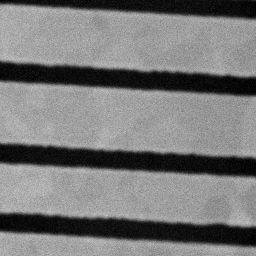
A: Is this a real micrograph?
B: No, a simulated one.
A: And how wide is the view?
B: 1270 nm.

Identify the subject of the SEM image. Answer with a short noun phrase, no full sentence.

lines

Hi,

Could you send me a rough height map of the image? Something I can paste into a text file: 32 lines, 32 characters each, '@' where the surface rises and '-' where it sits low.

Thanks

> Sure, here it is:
--------------------------------
@@@@@@@@@@@@@@@@----------------
@@@@@@@@@@@@@@@@@@@@@@@@@@@@@@@@
@@@@@@@@@@@@@@@@@@@@@@@@@@@@@@@@
@@@@@@@@@@@@@@@@@@@@@@@@@@@@@@@@
@@@@@@@@@@@@@@@@@@@@@@@@@@@@@@@@
@@@@@@@@@@@@@@@@@@@@@@@@@@@@@@@@
@@@@@@@@@@@@@@@@@@@@@@@@@@@@@@@@
------------@@@@@@@@@@@@@@@@@@@@
-----------------------------@@@
@@@@@@--------------------------
@@@@@@@@@@@@@@@@@@@@@@@---------
@@@@@@@@@@@@@@@@@@@@@@@@@@@@@@@@
@@@@@@@@@@@@@@@@@@@@@@@@@@@@@@@@
@@@@@@@@@@@@@@@@@@@@@@@@@@@@@@@@
@@@@@@@@@@@@@@@@@@@@@@@@@@@@@@@@
@@@@@@@@@@@@@@@@@@@@@@@@@@@@@@@@
@@@@@@@@@@@@@@@@@@@@@@@@@@@@@@@@
--------@@@@@@@@@@@@@@@@@@@@@@@@
--------------------------@@@@@@
@@@-----------------------------
@@@@@@@@@@@@@@@@@@@@@-----------
@@@@@@@@@@@@@@@@@@@@@@@@@@@@@@@@
@@@@@@@@@@@@@@@@@@@@@@@@@@@@@@@@
@@@@@@@@@@@@@@@@@@@@@@@@@@@@@@@@
@@@@@@@@@@@@@@@@@@@@@@@@@@@@@@@@
@@@@@@@@@@@@@@@@@@@@@@@@@@@@@@@@
-----------------@@@@@@@@@@@@@@@
--------------------------------
@@@@@@@@@@----------------------
@@@@@@@@@@@@@@@@@@@@@@@@@@@-----
@@@@@@@@@@@@@@@@@@@@@@@@@@@@@@@@